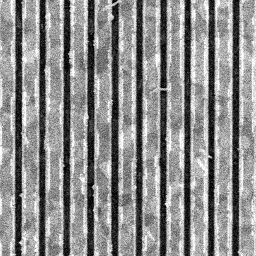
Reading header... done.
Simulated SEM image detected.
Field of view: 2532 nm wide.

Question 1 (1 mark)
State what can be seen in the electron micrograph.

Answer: parallel lines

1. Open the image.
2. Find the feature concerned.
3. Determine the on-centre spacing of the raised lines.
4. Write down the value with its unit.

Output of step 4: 238 nanometres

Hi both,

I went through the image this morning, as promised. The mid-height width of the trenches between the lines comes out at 82.8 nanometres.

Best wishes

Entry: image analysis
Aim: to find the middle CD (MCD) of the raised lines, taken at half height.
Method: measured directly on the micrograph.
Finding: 156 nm